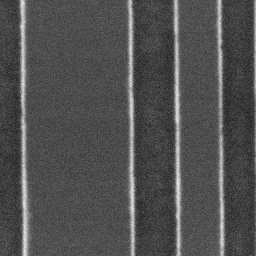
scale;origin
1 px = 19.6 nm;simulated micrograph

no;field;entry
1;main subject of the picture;lines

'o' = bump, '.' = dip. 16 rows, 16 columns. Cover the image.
.ooooooo...ooo..
.ooooooo...ooo..
.ooooooo...ooo..
.ooooooo...ooo..
.ooooooo...ooo..
.ooooooo...ooo..
.ooooooo...ooo..
.ooooooo...ooo..
.ooooooo...ooo..
.ooooooo...ooo..
.ooooooo...ooo..
.ooooooo...ooo..
..oooooo...ooo..
..oooooo...ooo..
..oooooo...ooo..
..oooooo...ooo..